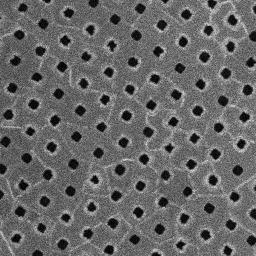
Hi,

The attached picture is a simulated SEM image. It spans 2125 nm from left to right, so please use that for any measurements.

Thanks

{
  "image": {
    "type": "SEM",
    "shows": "a regular array of holes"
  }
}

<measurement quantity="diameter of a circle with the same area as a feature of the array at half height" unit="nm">83.3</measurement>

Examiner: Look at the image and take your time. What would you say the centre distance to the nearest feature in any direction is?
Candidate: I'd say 219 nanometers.